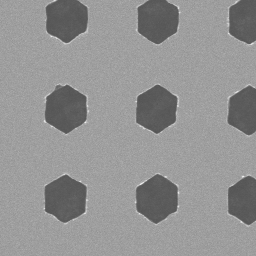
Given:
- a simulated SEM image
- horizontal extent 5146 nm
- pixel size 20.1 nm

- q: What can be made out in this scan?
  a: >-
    holes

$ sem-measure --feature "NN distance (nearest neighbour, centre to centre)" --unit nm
1800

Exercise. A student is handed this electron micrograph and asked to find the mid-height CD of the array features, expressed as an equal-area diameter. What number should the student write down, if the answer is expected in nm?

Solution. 890